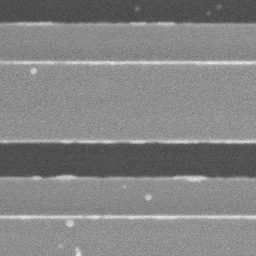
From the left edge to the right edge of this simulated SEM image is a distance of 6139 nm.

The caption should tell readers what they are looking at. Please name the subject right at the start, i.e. lines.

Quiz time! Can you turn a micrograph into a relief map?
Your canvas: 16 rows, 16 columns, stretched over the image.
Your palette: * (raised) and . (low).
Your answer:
................
****....***.....
****************
****************
****************
****************
****************
****************
****************
................
................
****************
****************
****************
****************
****************